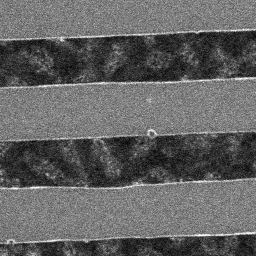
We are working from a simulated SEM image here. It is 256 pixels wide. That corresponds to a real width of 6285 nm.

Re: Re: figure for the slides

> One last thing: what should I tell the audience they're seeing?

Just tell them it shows one or a few lines or trenches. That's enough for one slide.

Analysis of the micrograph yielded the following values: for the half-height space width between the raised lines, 1290 nanometers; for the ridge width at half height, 1.19 µm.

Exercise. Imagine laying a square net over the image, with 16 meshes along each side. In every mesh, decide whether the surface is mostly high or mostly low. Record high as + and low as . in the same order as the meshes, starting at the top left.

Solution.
................
................
++++++++++++++++
++++++++++++++++
++++++++++++++++
................
................
................
........++++++++
++++++++++++++++
++++++++++++++++
++++++++++......
................
................
................
++++++++++++++++